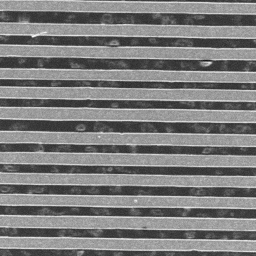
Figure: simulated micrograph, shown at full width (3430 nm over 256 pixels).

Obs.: parallel lines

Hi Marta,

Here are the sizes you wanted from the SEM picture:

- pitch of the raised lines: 288 nanometers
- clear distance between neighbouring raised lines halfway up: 134 nm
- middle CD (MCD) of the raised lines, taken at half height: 156 nanometers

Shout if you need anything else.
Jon